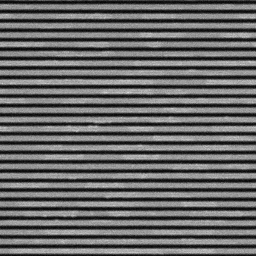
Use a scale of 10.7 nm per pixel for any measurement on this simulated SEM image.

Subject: parallel lines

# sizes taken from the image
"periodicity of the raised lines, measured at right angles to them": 100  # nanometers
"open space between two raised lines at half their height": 0.0428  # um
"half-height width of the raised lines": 0.0535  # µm